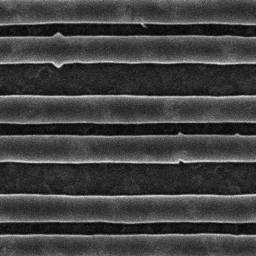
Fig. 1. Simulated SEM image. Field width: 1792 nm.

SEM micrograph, parallel lines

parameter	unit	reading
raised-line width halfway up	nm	185